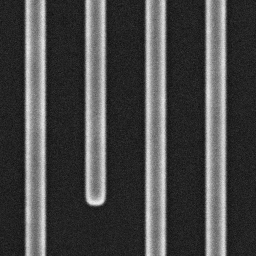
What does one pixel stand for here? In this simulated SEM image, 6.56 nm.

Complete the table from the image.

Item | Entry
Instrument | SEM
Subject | groups of lines, slits or small figures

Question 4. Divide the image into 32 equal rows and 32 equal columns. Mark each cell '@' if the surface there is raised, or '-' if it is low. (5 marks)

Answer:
---@@------@@-----@@@-----@@----
---@@------@@-----@@@-----@@----
---@@------@@-----@@@-----@@----
---@@------@@-----@@@-----@@----
---@@------@@-----@@@-----@@----
---@@------@@-----@@@-----@@----
---@@------@@-----@@@-----@@----
---@@------@@-----@@@-----@@----
---@@------@@-----@@@-----@@----
---@@------@@-----@@@-----@@----
---@@------@@-----@@@-----@@----
---@@------@@-----@@@-----@@----
---@@------@@-----@@@-----@@----
---@@------@@-----@@@-----@@----
---@@------@@-----@@@-----@@----
---@@------@@-----@@@-----@@----
---@@------@@-----@@@-----@@----
---@@------@@-----@@@-----@@----
---@@------@@-----@@@-----@@----
---@@------@@-----@@@-----@@----
---@@------@@-----@@@-----@@----
---@@------@@-----@@@-----@@----
---@@------@@-----@@@-----@@----
---@@------@@-----@@@-----@@----
---@@------@@-----@@@-----@@----
---@@-------------@@@-----@@----
---@@-------------@@@-----@@----
---@@-------------@@@-----@@----
---@@-------------@@@-----@@----
---@@-------------@@@-----@@----
---@@-------------@@@-----@@----
---@@-------------@@@-----@@----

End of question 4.